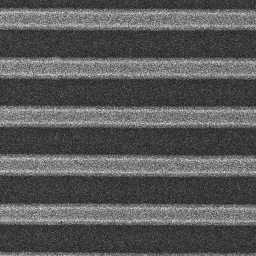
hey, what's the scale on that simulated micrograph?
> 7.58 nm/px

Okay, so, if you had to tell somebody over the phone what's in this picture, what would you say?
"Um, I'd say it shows parallel lines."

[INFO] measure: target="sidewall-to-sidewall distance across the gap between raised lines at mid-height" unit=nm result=242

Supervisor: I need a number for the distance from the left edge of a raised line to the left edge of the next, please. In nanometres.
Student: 370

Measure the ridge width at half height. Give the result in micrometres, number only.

0.128